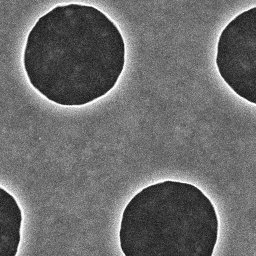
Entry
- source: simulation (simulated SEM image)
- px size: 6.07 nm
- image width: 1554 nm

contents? holes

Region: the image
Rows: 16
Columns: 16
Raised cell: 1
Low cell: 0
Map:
1110001111111111
1100000111111100
1100000011111100
1100000011111100
1100000011111100
1100000111111100
1111011111111111
1111111111111111
1111111111111111
1111111111111111
1111111111111111
1111111111001111
0111111100000111
0111111100000011
0111111100000011
0111111100000111